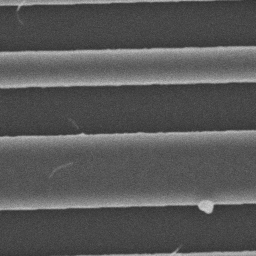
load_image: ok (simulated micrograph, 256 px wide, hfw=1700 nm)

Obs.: lines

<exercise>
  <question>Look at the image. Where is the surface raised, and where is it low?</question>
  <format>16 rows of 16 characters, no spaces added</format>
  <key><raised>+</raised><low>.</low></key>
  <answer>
................
................
................
++++++++++++++++
++++++++++++++++
................
................
................
....++++++++++++
++++++++++++++++
++++++++++++++++
++++++++++++++++
++++++++++++++++
................
................
................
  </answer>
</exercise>